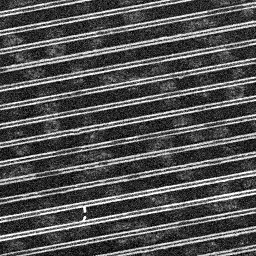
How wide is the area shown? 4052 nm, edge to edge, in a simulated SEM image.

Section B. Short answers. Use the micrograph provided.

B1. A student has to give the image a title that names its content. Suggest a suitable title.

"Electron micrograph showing parallel lines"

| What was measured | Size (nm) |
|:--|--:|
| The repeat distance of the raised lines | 291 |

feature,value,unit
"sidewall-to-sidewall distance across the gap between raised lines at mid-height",0.224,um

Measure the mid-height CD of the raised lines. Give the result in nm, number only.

70